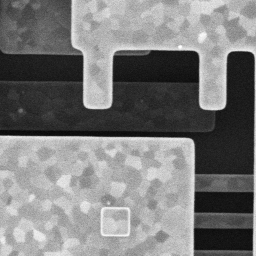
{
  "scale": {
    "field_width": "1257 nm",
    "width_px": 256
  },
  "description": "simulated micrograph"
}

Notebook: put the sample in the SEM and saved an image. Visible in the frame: wiring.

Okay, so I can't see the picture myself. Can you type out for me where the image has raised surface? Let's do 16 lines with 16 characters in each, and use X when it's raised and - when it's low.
----XXXXXXXXXXXX
----XXXXXXXXXXXX
----XXXXXXXXXXXX
-----XX-----XX--
-----XX-----XX--
-----XX-----XX--
-----XX------X--
----------------
X---------------
XXXXXXXXXXXX----
XXXXXXXXXXXX----
XXXXXXXXXXXX----
XXXXXXXXXXXX----
XXXXXXXXXXXX----
XXXXXXXXXXXX----
XXXXXXXXXXXX----